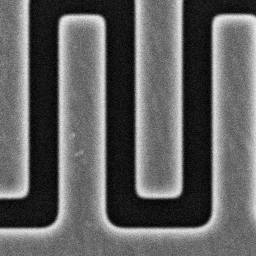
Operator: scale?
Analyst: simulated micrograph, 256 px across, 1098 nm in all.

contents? groups of lines, slits or small figures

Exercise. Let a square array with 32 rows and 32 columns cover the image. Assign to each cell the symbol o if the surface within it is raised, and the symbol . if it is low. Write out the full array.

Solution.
oooo.............oooooo.........
ooo..............oooooo.........
ooo.....ooooo....oooooo....ooooo
ooo....oooooo....oooooo....ooooo
ooo....oooooo....oooooo....ooooo
ooo....oooooo....oooooo....ooooo
ooo....oooooo....oooooo....ooooo
ooo....oooooo....oooooo....ooooo
ooo....oooooo....oooooo....ooooo
ooo....oooooo....oooooo....ooooo
ooo....oooooo....oooooo....ooooo
ooo....oooooo....oooooo....ooooo
oooo...oooooo....oooooo....ooooo
oooo...oooooo....oooooo....ooooo
oooo...oooooo....oooooo....ooooo
oooo...oooooo....oooooo....ooooo
oooo...oooooo....oooooo....ooooo
oooo...oooooo....oooooo....ooooo
oooo...oooooo....oooooo....ooooo
oooo...oooooo....oooooo....ooooo
oooo...oooooo....oooooo....ooooo
oooo....ooooo....oooooo....ooooo
oooo....ooooo....oooooo....ooooo
oooo....ooooo....oooooo....ooooo
ooo.....ooooo.....oooo.....ooooo
........ooooo..............ooooo
.......oooooo..............ooooo
.......ooooooo............oooooo
.....oooooooooo.........oooooooo
oooooooooooooooooooooooooooooooo
oooooooooooooooooooooooooooooooo
oooooooooooooooooooooooooooooooo